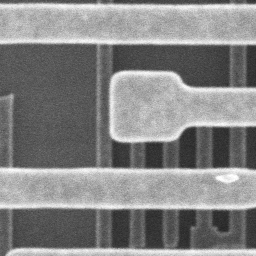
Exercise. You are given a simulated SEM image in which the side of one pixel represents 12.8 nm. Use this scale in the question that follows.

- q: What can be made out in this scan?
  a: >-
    wiring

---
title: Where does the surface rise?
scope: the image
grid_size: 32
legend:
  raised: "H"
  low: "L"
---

LLLLLLLLLLLLLLLLLLLLLLLLLLLLLLLL
HHHHHHHHHHHHHHHHHHHHHHHHHHHHHHHH
HHHHHHHHHHHHHHHHHHHHHHHHHHHHHHHH
HHHHHHHHHHHHHHHHHHHHHHHHHHHHHHHH
HHHHHHHHHHHHHHHHHHHHHHHHHHHHHHHH
LLLLLLLLLLLLLLLLLLLLLLLLLLLLLLLL
LLLLLLLLLLLLLLLLLLLLLLLLLLLLLLLL
LLLLLLLLLLLLLLLLLLLLLLLLLLLLLLLL
LLLLLLLLLLLLLLLLLLLLLLLLLLLLLLLL
LLLLLLLLLLLLLLHHHHHHHHLLLLLLLLLL
LLLLLLLLLLLLLLHHHHHHHHHLLLLLLLLL
LLLLLLLLLLLLLLHHHHHHHHHHHHHHHHHH
LLLLLLLLLLLLLLHHHHHHHHHHHHHHHHHH
LLLLLLLLLLLLLLHHHHHHHHHHHHHHHHHH
LLLLLLLLLLLLLLHHHHHHHHHHHHHHHHHH
LLLLLLLLLLLLLLHHHHHHHHHHHHHHHHHH
LLLLLLLLLLLLLLHHHHHHHHHLLLLLLLLL
LLLLLLLLLLLLLLHHHHHHHHLLLLLLLLLL
LLLLLLLLLLLLLLLLLLLLLLLLLLLLLLLL
LLLLLLLLLLLLLLLLLLLLLLLLLLLLLLLL
LLLLLLLLLLLLLLLLLLLLLLLLLLLLLLLL
HHHHHHHHHHHHHHHHHHHHHHHHHHHHHHHH
HHHHHHHHHHHHHHHHHHHHHHHHHHHHHHHH
HHHHHHHHHHHHHHHHHHHHHHHHHHHHHHHH
HHHHHHHHHHHHHHHHHHHHHHHHHHHHHHHH
HHHHHHHHHHHHHHHHHHHHHHHHHHHHHHHH
LLLLLLLLLLLLLLLLLLLLLLLLLLLLLLLL
LLLLLLLLLLLLLLLLLLLLLLLLLLLLLLLL
LLLLLLLLLLLLLLLLLLLLLLLLLLLLLLLL
LLLLLLLLLLLLLLLLLLLLLLLLLLLLLLLL
LLLLLLLLLLLLLLLLLLLLLLLLLLLLLLLL
LHHHHHHHHHHHHHHHHHHHHHHHHHHHHHHH